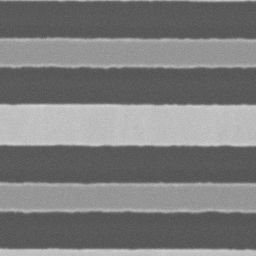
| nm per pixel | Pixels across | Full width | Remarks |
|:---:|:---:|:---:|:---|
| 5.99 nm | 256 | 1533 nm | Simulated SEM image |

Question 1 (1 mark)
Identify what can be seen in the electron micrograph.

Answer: lines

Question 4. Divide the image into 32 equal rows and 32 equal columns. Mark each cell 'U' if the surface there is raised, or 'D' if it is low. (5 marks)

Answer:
DDDDDDDDDDDDDDDDDDDDDDDDDDDDDDDD
DDDDDDDDDDDDDDDDDDDDDDDDDDDDDDDD
DDDDDDDDDDDDDDDDDDDDDDDDDDDDDDDD
DDDDDDDDDDDDDDDDDDDDDDDDDDDDDDDD
DDDDDDDDDDDDDDDDDDDDDDDDDDDDDDDD
UUUUUUUUUUUUUUUUUUUUUUUUUUUUUUUU
UUUUUUUUUUUUUUUUUUUUUUUUUUUUUUUU
UUUUUUUUUUUUUUUUUUUUUUUUUUUUUUUU
DDDDDDDDDDDDDDDDDDDDDDDDDDDDDDDD
DDDDDDDDDDDDDDDDDDDDDDDDDDDDDDDD
DDDDDDDDDDDDDDDDDDDDDDDDDDDDDDDD
DDDDDDDDDDDDDDDDDDDDDDDDDDDDDDDD
DDDDDDDDDDDDDDDDDDDDDDDDDDDDDDDD
UUUUUUUUUUUUUUUUUUUUUUUUUUUUUUUU
UUUUUUUUUUUUUUUUUUUUUUUUUUUUUUUU
UUUUUUUUUUUUUUUUUUUUUUUUUUUUUUUU
UUUUUUUUUUUUUUUUUUUUUUUUUUUUUUUU
UUUUUUUUUUUUUUUUUUUUUUUUUUUUUUUU
DDDDDDDDDDDDDDDDDDDDDDDDDDDDDDDD
DDDDDDDDDDDDDDDDDDDDDDDDDDDDDDDD
DDDDDDDDDDDDDDDDDDDDDDDDDDDDDDDD
DDDDDDDDDDDDDDDDDDDDDDDDDDDDDDDD
DDDDDDDDDDDDDDDDDDDDDDDDDDDDDDDD
UUUUUUUUUUUUUUUUUUUUUUUUUUUUUUUU
UUUUUUUUUUUUUUUUUUUUUUUUUUUUUUUU
UUUUUUUUUUUUUUUUUUUUUUUUUUUUUUUU
DDDUDDDDDDDDDDDDDDDDUUDDUDDDUDUU
DDDDDDDDDDDDDDDDDDDDDDDDDDDDDDDD
DDDDDDDDDDDDDDDDDDDDDDDDDDDDDDDD
DDDDDDDDDDDDDDDDDDDDDDDDDDDDDDDD
DDDDDDDDDDDDDDDDDDDDDDDDDDDDDDDD
UUUUUUUUUUUUUUUUUUUUUUUUUUUUUUUU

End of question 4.